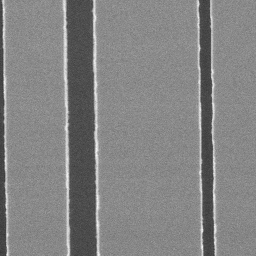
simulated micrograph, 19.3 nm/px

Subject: lines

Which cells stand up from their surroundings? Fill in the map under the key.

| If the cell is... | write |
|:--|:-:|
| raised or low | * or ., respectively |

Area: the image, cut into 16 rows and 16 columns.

****..**********
****..**********
****..**********
****..**********
****..**********
****..**********
****..**********
****..**********
****..**********
****..**********
****..**********
****..**********
****..**********
****..**********
****..**********
****..**********